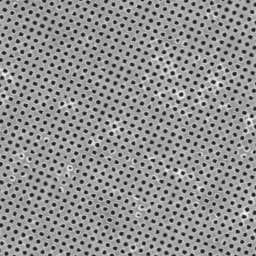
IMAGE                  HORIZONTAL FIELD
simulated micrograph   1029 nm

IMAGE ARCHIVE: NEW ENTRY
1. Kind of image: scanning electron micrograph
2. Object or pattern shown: a regular array of holes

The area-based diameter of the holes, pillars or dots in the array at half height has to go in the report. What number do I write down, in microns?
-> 0.017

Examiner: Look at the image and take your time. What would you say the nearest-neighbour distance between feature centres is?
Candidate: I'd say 31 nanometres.